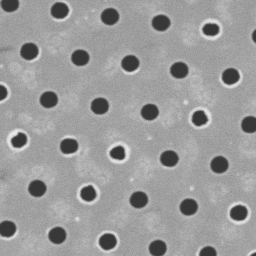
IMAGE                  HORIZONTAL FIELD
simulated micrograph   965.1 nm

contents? a regular array of holes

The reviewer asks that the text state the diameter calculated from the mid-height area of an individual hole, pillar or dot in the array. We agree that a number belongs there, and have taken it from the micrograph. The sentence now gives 63.2 nanometres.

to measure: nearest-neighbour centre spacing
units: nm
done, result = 190